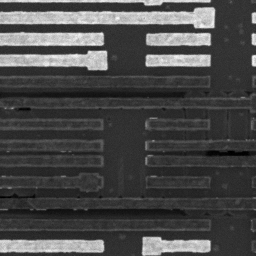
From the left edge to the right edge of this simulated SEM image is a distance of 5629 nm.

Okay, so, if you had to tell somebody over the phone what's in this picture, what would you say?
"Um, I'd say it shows wiring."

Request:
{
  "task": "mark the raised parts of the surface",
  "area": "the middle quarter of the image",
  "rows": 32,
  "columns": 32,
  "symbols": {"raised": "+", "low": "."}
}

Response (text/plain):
.....++++++.....................
................................
................................
++++++++++++++++++++++++++++++++
++++++++++++++++++++++++++++++++
++++++++++++++++++++++++++++++++
................................
................................
................................
++++++++++++++++++++++++++++++++
++++++++++++++++++++++++++++++++
................................
................................
................................
+++++++++............+++++++++++
+++++++++............+++++++++++
................................
................................
................................
+++++++++............+++++++++++
+++++++++............+++++++++++
.+++++..........................
................................
+++++++++............+++++++++++
++++++++++...........+++++++++++
................................
................................
................................
+.+++++++............+++++++++++
++++++++++...........+++++++++++
++++++++++...........+++++++++++
....++++........................